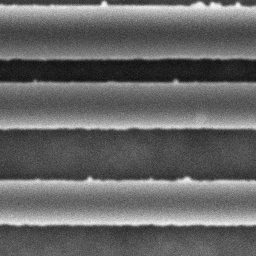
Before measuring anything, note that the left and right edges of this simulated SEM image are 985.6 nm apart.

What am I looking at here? lines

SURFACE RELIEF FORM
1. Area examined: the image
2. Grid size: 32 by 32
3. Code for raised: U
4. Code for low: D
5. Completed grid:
DDDDDDDDDDDDDDDDDDDDDDDDDDDDDDDD
UUUUUUUUUUUUUUUUUUUUUUUUUUUUUUUU
UUUUUUUUUUUUUUUUUUUUUUUUUUUUUUUU
UUUUUUUUUUUUUUUUUUUUUUUUUUUUUUUU
UUUUUUUUUUUUUUUUUUUUUUUUUUUUUUUU
UUUUUUUUUUUUUUUUUUUUUUUUUUUUUUUU
UUUUUUUUUUUUUUUUUUUUUUUUUUUUUUUU
DDDDDDDDDDDDDDDDDDDDDDDDDDDDDDDD
DDDDDDDDDDDDDDDDDDDDDDDDDDDDDDDD
DDDDDDDDDDDDDDDDDDDDDDDDDDDDDDDD
UUUUUUUUUUUUUUUUUUUUUUUUUUUUUUUU
UUUUUUUUUUUUUUUUUUUUUUUUUUUUUUUU
UUUUUUUUUUUUUUUUUUUUUUUUUUUUUUUU
UUUUUUUUUUUUUUUUUUUUUUUUUUUUUUUU
UUUUUUUUUUUUUUUUUUUUUUUUUUUUUUUU
UUUUUUUUUUUUUUUUUUUUUUUUUUUUUUUU
DDDDDDDDDDDDDDDDDDDDDDDDDDDDDDDD
DDDDDDDDDDDDDDDDDDDDDDDDDDDDDDDD
DDDDDDDDDDDDDDDDDDDDDDDDDDDDDDDD
DDDDDDDDDDDDDDDDDDDDDDDDDDDDDDDD
DDDDDDDDDDDDDDDDDDDDDDDDDDDDDDDD
DDDDDDDDDDDDDDDDDDDDDDDDDDDDDDDD
DDDDDDDDDDDDDDDDDDDDDDDDDDDDDDDD
UUUUUUUUUUUUUUUUUUUUUUUUUUUUUUUU
UUUUUUUUUUUUUUUUUUUUUUUUUUUUUUUU
UUUUUUUUUUUUUUUUUUUUUUUUUUUUUUUU
UUUUUUUUUUUUUUUUUUUUUUUUUUUUUUUU
UUUUUUUUUUUUUUUUUUUUUUUUUUUUUUUU
DDDDDDDDDDDDDDDDDDDDDDDDDDDDDDDD
DDDDDDDDDDDDDDDDDDDDDDDDDDDDDDDD
DDDDDDDDDDDDDDDDDDDDDDDDDDDDDDDD
DDDDDDDDDDDDDDDDDDDDDDDDDDDDDDDD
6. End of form